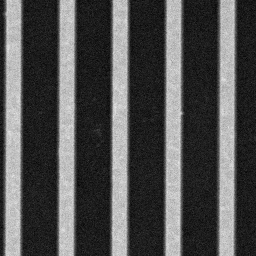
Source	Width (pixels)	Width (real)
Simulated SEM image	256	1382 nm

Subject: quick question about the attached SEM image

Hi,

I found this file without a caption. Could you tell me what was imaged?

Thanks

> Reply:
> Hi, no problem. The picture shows parallel lines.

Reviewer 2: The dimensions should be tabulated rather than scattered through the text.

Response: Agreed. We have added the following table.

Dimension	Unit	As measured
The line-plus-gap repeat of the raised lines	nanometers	288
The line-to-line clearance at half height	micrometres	0.198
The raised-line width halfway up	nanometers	86.4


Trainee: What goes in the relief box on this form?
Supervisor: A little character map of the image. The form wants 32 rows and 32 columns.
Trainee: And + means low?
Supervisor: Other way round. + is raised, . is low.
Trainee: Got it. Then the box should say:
.++....++.....++.....++.....+...
.++....++.....++.....++....++...
.++....++.....++.....++.....+...
.++....++.....++.....++.....+...
.++....++.....++.....++....++...
.++....++.....++.....++.....+...
.++....++.....++.....++.....+...
.++....++.....++.....++....++...
.++....++.....++.....++....++...
.++....++.....++.....++....++...
.++....++.....++.....++....++...
.++....++.....++.....++....++...
.++....++.....++.....++....++...
.++....++.....++.....++....++...
.++....++.....++.....++....++...
.++....++.....++.....++....++...
.++....++.....++.....++....++...
.++....++.....++.....++....++...
.++....++.....++.....++....++...
.++....++.....++.....++....++...
.++....++.....++.....++....++...
.++....++.....++.....++....++...
.++....++.....++.....++....++...
.++....++.....++.....++....++...
.++....++.....++.....++....++...
.++....++.....++.....++....++...
.++....++.....++.....++....++...
.++....++.....++.....++....++...
.++....++.....++.....++....++...
.++....++.....++.....++....++...
.++....++.....++.....++....++...
.++....++.....++.....++....++...